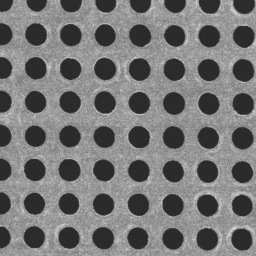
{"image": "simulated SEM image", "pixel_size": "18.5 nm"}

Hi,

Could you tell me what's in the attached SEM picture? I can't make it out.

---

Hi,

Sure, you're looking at a regular array of holes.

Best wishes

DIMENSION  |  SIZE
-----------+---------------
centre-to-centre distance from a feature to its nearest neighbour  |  33.6 px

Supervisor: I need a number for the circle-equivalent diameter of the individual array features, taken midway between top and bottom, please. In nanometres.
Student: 406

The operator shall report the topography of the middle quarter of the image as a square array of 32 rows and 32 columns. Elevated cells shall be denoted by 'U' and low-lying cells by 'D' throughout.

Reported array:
DDDDUUUUDDDDDUUUDDDDDUUUUDDDDDUU
DDDDUUUDDDDDDUUUDDDDDDUUUDDDDDUU
DDDDUUUUDDDDDUUUDDDDDUUUUDDDDDUU
DDDUUUUUUDDDUUUUUDDDDUUUUUDDDDUU
UUUUUUUUUUUUUUUUUUUUUUUUUUUUUUUU
UUUUUUUUUUUUUUUUUUUUUUUUUUUUUUUU
UUUUUUUUUUUUUUUUUUUUUUUUUUUUUUUU
DDDUUUUUDDDDUUUUUDDDUUUUUUDDDUUU
DDDDUUUUDDDDDUUUDDDDDUUUUDDDDDUU
DDDDUUUDDDDDDUUUDDDDDDUUUDDDDDUU
DDDDUUUUDDDDDUUUDDDDDUUUUDDDDDUU
DDDUUUUUDDDDUUUUUDDDDUUUUDDDDDUU
UUUUUUUUUUDUUUUUUUDDUUUUUUUDDUUU
UUUUUUUUUUUUUUUUUUUUUUUUUUUUUUUU
UUUUUUUUUUUUUUUUUUUUUUUUUUUUUUUU
UDUUUUUUUUUUUUUUUUUUUUUUUUUUUUUU
DDDUUUUUDDDDUUUUUDDDDUUUUDDDDUUU
DDDDUUUDDDDDDUUUDDDDDUUUUDDDDDUU
DDDDUUUDDDDDDUUUDDDDDDUUUDDDDDUU
DDDDUUUUDDDDDUUUDDDDDUUUUDDDDDUU
DDDUUUUUUDDDUUUUUDDDDUUUUUDDDUUU
UUUUUUUUUUUUUUUUUUUUUUUUUUUUUUUU
UUUUUUUUUUUUUUUUUUUUUUUUUUUUUUUU
UUUUUUUUUUUUUUUUUUUUUUUUUUUUUUUU
DDDUUUUUDDDDUUUUUDDDUUUUUUDDDUUU
DDDDUUUDDDDDUUUUDDDDDUUUUDDDDDUU
DDDDUUUDDDDDDUUUDDDDDUUUUDDDDDUU
DDDDUUUDDDDDDUUUDDDDDUUUUDDDDDUU
DDDDUUUUDDDDUUUUUDDDDUUUUDDDDDUU
UUUUUUUUUUUUUUUUUUUUUUUUUUUDUUUU
UUUUUUUUUUUUUUUUUUUUUUUUUUUUUUUU
UUUUUUUUUUUUUUUUUUUUUUUUUUUUUUUU